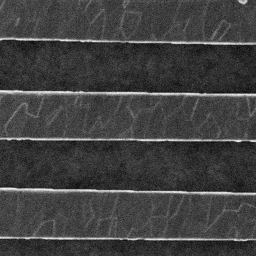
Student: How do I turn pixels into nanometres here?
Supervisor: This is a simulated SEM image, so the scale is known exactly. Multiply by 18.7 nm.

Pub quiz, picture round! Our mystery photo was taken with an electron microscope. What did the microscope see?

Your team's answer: lines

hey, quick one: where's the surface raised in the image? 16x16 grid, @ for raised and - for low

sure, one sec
@@@@@@@@@@@@@@@@
@@@@@@@@@@@@@@@@
---@@@@@@@@@@@@@
----------------
----------------
----------------
@@@@@@@@@@@@@@@@
@@@@@@@@@@@@@@@@
@@@@@@@@@@@@@@@@
----------------
----------------
----------------
@@@@@@@@@@@@@@@@
@@@@@@@@@@@@@@@@
@@@@@@@@@@@@@@@@
----------------